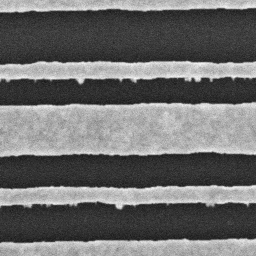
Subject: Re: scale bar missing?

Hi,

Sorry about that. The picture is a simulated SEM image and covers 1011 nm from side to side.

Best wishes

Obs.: lines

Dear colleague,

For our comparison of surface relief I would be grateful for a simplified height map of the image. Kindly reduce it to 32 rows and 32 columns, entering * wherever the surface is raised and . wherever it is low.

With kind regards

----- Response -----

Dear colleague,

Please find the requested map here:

********************************
................................
................................
................................
................................
................................
................................
................................
********************************
********************************
................................
................................
................................
********************************
********************************
********************************
********************************
********************************
********************************
*...............................
................................
................................
................................
....**********.....*************
********************************
****.***......****........*.....
................................
................................
................................
................................
********************************
********************************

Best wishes